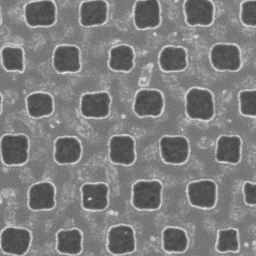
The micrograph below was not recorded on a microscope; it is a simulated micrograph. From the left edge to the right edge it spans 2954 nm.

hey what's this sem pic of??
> a regular array of raised bodies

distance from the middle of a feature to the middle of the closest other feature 600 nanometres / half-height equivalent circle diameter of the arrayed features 351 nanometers